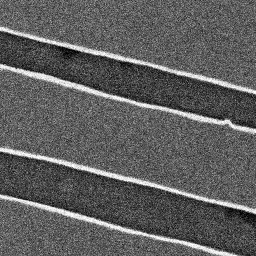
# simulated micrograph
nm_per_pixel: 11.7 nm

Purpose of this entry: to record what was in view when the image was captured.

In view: one or a few lines or trenches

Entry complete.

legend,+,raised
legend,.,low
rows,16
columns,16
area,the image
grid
++++++++++++++++
++++++++++++++++
...+++++++++++++
.......+++++++++
+..........+++++
+++++..........+
+++++++++.......
+++++++++++++...
++++++++++++++++
.+++++++++++++++
.....+++++++++++
.........+++++++
+............+++
+++++...........
++++++++........
+++++++++++++...